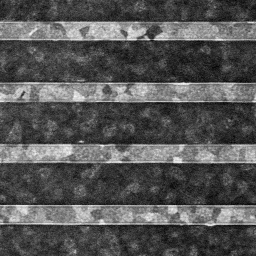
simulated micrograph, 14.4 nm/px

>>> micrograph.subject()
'one or a few lines or trenches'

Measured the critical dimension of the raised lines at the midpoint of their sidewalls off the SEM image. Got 253 nm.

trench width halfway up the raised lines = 0.627 um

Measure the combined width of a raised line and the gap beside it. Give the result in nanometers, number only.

881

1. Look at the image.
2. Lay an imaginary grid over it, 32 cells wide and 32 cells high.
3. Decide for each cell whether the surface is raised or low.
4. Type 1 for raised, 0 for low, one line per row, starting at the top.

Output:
00000000000000000000000000000000
00000000000000000000000000000000
00000000000000000000000000000000
11111111111111111111111111111111
11111111111111111111111111111111
00000000000000000000000000000000
00000000000000000000000000000000
00000000000000000000000000000000
00000000000000000000000000000000
00000000000000000000000000000000
11111111111111110000000011111110
11111111111111111111111111111111
11111111111111111111111111111111
00000000000000000000000000000000
00000000000000000000000000000000
00000000000000000000000000000000
00000000000000000000000000000000
00000000000000000000000000000000
11111111111111111111111111111111
11111111111111111111111111111111
00000000000000000000000000000000
00000000000000000000000000000000
00000000000000000000000000000000
00000000000000000000000000000000
00000000000000000000000000000000
00000000000000000000000000000000
11111111111111111111111111111111
11111111111111111111111111111111
00000000000000000000000000000000
00000000000000000000000000000000
00000000000000000000000000000000
00000000000000000000000000000000